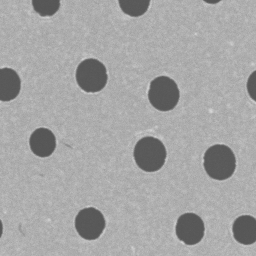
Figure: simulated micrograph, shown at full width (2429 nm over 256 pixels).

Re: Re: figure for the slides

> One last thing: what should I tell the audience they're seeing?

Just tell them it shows holes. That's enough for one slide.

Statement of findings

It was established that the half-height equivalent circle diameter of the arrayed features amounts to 0.313 microns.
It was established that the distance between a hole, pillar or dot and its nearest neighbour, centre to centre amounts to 0.692 um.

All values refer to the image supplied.